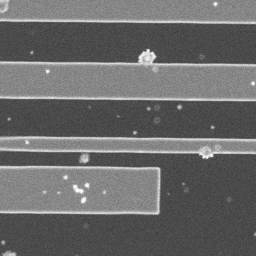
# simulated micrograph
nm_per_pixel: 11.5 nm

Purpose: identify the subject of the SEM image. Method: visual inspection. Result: groups of lines, slits or small figures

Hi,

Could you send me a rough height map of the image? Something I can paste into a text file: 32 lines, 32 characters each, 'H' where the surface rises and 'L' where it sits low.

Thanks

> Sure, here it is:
HHHHHHHHHHHHHHHHHHHHHHHHHHHHHHHH
HHHHHHHHHHHHHHHHHHHHHHHHHHHHHHHH
HHHHHHHHHHHHHHHHHHHHHHHHHHHHHHHH
LLLLLLLLLLLLLLLLLLLLLLLLLLLLLLLL
LLLLLLLLLLLLLLLLLLLLLLLLLLLLLLLL
LLLLLLLLLLLLLLLLLLLLLLLLLLLLLLLL
LLLLLLLLLLLLLLLLLLHLLLLLLLLLLLLL
LLLLLLLLLLLLLLLLLHHLLLLLLLLLLLLL
HHHHHHHHHHHHHHHHHHHHHHHHHHHHHHHH
HHHHHHHHHHHHHHHHHHHHHHHHHHHHHHHH
HHHHHHHHHHHHHHHHHHHHHHHHHHHHHHHH
HHHHHHHHHHHHHHHHHHHHHHHHHHHHHHHH
LLLLLLLLLLLLLLLLLLLLLLLLLLLLLHHH
LLLLLLLLLLLLLLLLLLLLLLLLLLLLLLLL
LLLLLLLLLLLLLLLLLLLLLLLLLLLLLLLL
LLLLLLLLLLLLLLLLLLLLLLLLLLLLLLLL
LLLLLLLLLLLLLLLLLLLLLLLLLLLLLLLL
HHHHHHHHHHHHHHHHHHHHHHHHHHHHHHHH
HHHHHHHHHHHHHHHHHHHHHHHHHHHHHHHH
LLLLLLLLLLLLLLLLLLLLLLLLLHLLLLLL
LLLLLLLLLLLLLLLLLLLLLLLLLLLLLLLL
HHHHHHHHHHHHHHHHHHHHLLLLLLLLLLLL
HHHHHHHHHHHHHHHHHHHHLLLLLLLLLLLL
HHHHHHHHHHHHHHHHHHHHLLLLLLLLLLLL
HHHHHHHHHHHHHHHHHHHHLLLLLLLLLLLL
HHHHHHHHHHHHHHHHHHHHLLLLLLLLLLLL
HHHHHHHHHHHHHHHHHHHHLLLLLLLLLLLL
LLLLLLLLLLLLLLLLLLLLLLLLLLLLLLLL
LLLLLLLLLLLLLLLLLLLLLLLLLLLLLLLL
LLLLLLLLLLLLLLLLLLLLLLLLLLLLLLLL
LLLLLLLLLLLLLLLLLLLLLLLLLLLLLLLL
LLLLLLLLLLLLLLLLLLLLLLLLLLLLLLLL